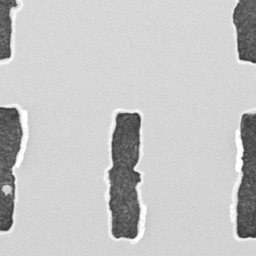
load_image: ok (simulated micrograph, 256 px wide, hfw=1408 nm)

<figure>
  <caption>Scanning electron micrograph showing holes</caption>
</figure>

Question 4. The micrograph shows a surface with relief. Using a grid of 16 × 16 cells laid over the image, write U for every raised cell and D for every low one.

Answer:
DUUUUUUUUUUUUUUD
DUUUUUUUUUUUUUUD
DUUUUUUUUUUUUUUD
DUUUUUUUUUUUUUUD
UUUUUUUUUUUUUUUU
UUUUUUUUUUUUUUUU
UUUUUUUUUUUUUUUU
DUUUUUUDDUUUUUUD
DUUUUUUDDUUUUUUD
DUUUUUUDDUUUUUUD
DUUUUUUDDUUUUUUD
DUUUUUUDDUUUUUUD
DUUUUUUDDUUUUUUD
DUUUUUUDDUUUUUUD
UUUUUUUDDUUUUUUD
UUUUUUUUUUUUUUUU